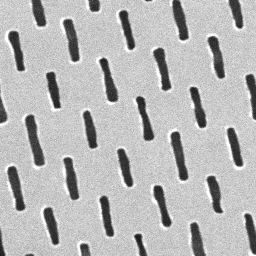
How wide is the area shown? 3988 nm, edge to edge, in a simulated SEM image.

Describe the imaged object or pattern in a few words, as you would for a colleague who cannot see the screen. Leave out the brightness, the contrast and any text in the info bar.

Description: a regular array of holes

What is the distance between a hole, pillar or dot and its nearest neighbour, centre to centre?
799 nm